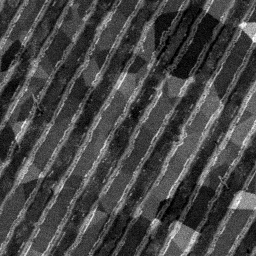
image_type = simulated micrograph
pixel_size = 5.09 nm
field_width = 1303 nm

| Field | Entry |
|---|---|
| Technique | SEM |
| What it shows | parallel lines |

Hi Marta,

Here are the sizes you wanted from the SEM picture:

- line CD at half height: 114 nanometers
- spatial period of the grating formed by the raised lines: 205 nm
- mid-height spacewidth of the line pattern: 0.09 um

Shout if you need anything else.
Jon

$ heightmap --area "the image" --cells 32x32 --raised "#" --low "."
...###..####..####..###...###...
..###...###...###...###..###...#
..###..####..###...###...###..##
.###...###...###..####..###...##
.###..####..###...###...###..###
###...###...###..####..###...###
###..####..###...###...###..###.
##..####...###..###...###...###.
##..###...###...###..####..###..
#...###..####..###...###...###..
#..###...###...###..####..###...
...###..###...###...###...###..#
..###...###..####..###...###...#
.####..###...###..####..####..##
.###...###..####..###...###...##
###...###...###..####..###...###
###...###..###...###...###...###
##...###...###..####..###...###.
##..###...###...###...###..####.
#...###...###..####..###...###..
#..###...###...###...###..####..
...###..####..###...###...###..#
..###...###...###...###..###...#
..###..###...###...###...###..##
.###...###...###..####..###...##
####..###...###...###...###..###
###..####..####..###...###...###
###..###...###...###..####..####
##..####..####..###...###..####.
#...###...###...###..####..###..
#..####..###...###...###...###..
...###..####..###...###...###...